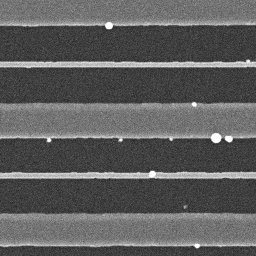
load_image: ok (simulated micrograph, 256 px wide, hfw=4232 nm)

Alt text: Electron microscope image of lines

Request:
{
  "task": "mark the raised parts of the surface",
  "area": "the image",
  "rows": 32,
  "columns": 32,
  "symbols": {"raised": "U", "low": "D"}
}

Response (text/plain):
UUUUUUUUUUUUUUUUUUUUUUUUUUUUUUUU
UUUUUUUUUUUUUUUUUUUUUUUUUUUUUUUU
UUUUUUUUUUUUUUUUUUUUUUUUUUUUUUUU
DDDDDDDDDDDDDUDDDDDDDDDDDDDDDDDD
DDDDDDDDDDDDDDDDDDDDDDDDDDDDDDDD
DDDDDDDDDDDDDDDDDDDDDDDDDDDDDDDD
DDDDDDDDDDDDDDDDDDDDDDDDDDDDDDDD
DDDDDDDDDDDDDDDDDDDDDDDDDDDDDDDD
DDDDDDDDDDDDDDDDDDDDDDDDDDDDDDDD
DDDDDDDDDDDDDDDDDDDDDDDDDDDDDDDD
DDDDDDDDDDDDDDDDDDDDDDDDDDDDDDDD
DDDDDDDDDDDDDDDDDDDDDDDDDDDDDDDD
DDDDDDDDDDDDDDDDDDDDDDDDDDDDDDDD
UUUUUUUUUUUUUUUUUUUUUUUUUUUUUUUU
UUUUUUUUUUUUUUUUUUUUUUUUUUUUUUUU
UUUUUUUUUUUUUUUUUUUUUUUUUUUUUUUU
UUUUUUUUUUUUUUUUUUUUUUUUUUUUUUUU
DDDDDDDDDDDDDDDDDDDDDDDDDDUUUDDD
DDDDDDDDDDDDDDDDDDDDDDDDDDDDDDDD
DDDDDDDDDDDDDDDDDDDDDDDDDDDDDDDD
DDDDDDDDDDDDDDDDDDDDDDDDDDDDDDDD
DDDDDDDDDDDDDDDDDDDUDDDDDDDDDDDD
DDDDDDDDDDDDDDDDDDDDDDDDDDDDDDDD
DDDDDDDDDDDDDDDDDDDDDDDDDDDDDDDD
DDDDDDDDDDDDDDDDDDDDDDDDDDDDDDDD
DDDDDDDDDDDDDDDDDDDDDDDDDDDDDDDD
DDDDDDDDDDDDDDDDDDDDDDDDDDDDDDDD
UUUUUUUUUUUUUUUUUUUUUUUUUUUUUUUU
UUUUUUUUUUUUUUUUUUUUUUUUUUUUUUUU
UUUUUUUUUUUUUUUUUUUUUUUUUUUUUUUU
UUUUUUUUUUUUUUUUUUUUUUUUUUUUUUUU
DDDDDDDDDDDDDDDDDDDDDDDDDDDDDDDD